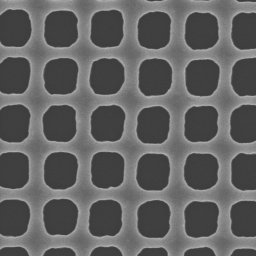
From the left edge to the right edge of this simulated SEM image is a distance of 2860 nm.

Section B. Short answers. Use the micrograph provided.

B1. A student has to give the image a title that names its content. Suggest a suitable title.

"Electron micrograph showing a regular array of holes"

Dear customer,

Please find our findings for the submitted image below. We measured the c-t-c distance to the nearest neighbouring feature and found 46.1 pixels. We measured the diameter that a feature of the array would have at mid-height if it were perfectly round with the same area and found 416 nanometers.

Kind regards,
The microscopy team